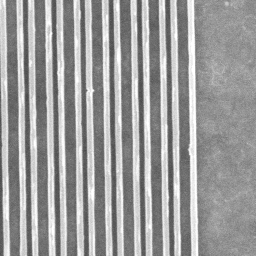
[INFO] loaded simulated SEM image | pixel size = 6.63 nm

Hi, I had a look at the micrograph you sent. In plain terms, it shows parallel lines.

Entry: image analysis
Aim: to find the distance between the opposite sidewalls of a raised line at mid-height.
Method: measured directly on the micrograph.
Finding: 34.8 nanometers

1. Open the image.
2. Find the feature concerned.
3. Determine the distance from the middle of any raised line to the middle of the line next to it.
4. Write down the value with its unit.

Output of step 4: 95.7 nm